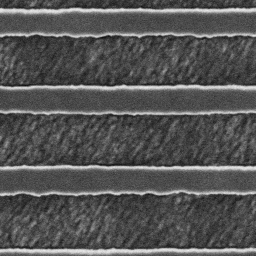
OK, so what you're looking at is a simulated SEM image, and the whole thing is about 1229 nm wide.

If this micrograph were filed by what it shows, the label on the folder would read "lines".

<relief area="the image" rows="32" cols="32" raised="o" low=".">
................................
oooooooooooooooooooooooooooooooo
oooooooooooooooooooooooooooooooo
oooooooooooooooooooooooooooooooo
.......o.oooo....o......ooo....o
................................
................................
................................
................................
................................
................................
oooooooooooooooooooooooooooooooo
oooooooooooooooooooooooooooooooo
oooooooooooooooooooooooooooooooo
................................
................................
................................
................................
................................
................................
................................
oooooooooooooooooooooooooooooooo
oooooooooooooooooooooooooooooooo
oooooooooooooooooooooooooooooooo
................................
................................
................................
................................
................................
................................
................................
oooooooooooooooooooooooooooooooo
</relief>